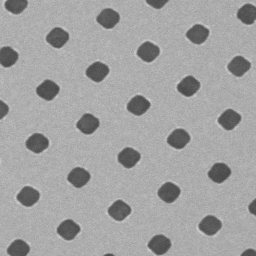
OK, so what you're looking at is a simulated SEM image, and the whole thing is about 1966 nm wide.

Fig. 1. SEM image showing a regular array of holes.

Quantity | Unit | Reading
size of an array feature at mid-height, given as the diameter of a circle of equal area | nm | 169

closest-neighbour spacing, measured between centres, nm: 404